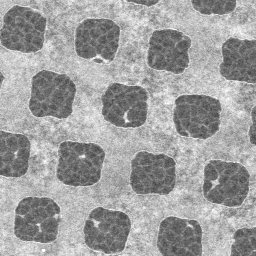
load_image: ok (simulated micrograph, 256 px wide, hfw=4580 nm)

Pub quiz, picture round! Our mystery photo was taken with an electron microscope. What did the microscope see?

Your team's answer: a regular array of raised bodies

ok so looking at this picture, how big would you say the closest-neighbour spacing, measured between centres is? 1.27 micrometres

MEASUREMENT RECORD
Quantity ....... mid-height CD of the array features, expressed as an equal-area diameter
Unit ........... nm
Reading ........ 811